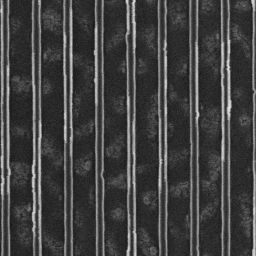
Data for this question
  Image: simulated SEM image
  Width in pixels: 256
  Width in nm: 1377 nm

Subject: parallel lines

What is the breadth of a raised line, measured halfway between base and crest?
7.75 px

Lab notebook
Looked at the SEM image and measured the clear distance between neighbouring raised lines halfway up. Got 126 nm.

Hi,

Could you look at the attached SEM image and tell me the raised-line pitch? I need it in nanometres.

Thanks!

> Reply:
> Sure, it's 169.